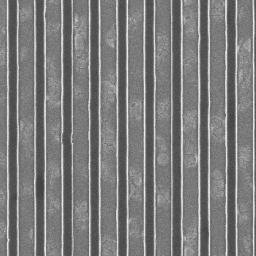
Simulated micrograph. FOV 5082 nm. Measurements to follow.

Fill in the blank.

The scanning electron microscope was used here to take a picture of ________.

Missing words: parallel lines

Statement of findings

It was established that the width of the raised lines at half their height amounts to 213 nanometers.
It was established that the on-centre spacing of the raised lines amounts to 543 nm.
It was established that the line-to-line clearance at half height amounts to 0.338 micrometres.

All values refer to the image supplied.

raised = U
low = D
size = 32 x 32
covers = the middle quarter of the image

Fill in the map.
UUDDDDUUUDDDDUUUDDDDUUUDDDDUUDDD
UUDDDDUUUDDDDUUUDDDDUUUDDDDUUDDD
UUDDDDUUUDDDDUUUDDDDUUUDDDDUUDDD
UUDDDDUUUDDDDUUUDDDDUUUDDDDUUDDD
UUDDDDUUUDDDDUUUDDDDUUUDDDDUUDDD
UUDDDDUUUDDDDUUUDDDDUUUDDDDUUDDD
UUDDDDUUUDDDDUUUDDDDUUUDDDDUUDDD
UUDDDDDUUDDDDUUUDDDDUUUDDDDUUDDD
UUDDDDUUUDDDDUUUDDDDUUUDDDDUUDDD
UUDDDDUUUDDDDUUUDDDDUUUDDDDUUDDD
UUDDDDUUUDDDDUUUDDDDUUUDDDDUUDDD
UUDDDDUUUDDDDUUUDDDDUUUDDDDUUDDD
UUDDDDUUUDDDDUUUDDDDUUUDDDDUUDDD
UUDDDDUUUDDDDUUUDDDDUUUDDDDUUDDD
UUDDDDUUUDDDDUUUDDDDUUUDDDDUUDDD
UUDDDDUUUDDDDUUUDDDDUUUDDDDUUDDD
UUDDDDUUUDDDDUUUDDDDUUUDDDDUUDDD
UUDDDDUUUDDDDUUUDDDDUUUDDDDUUDDD
UUDDDDUUUDDDDUUUDDDDUUUDDDDUUDDD
UUDDDDUUUDDDDUUUDDDDUUUDDDDUUDDD
UUDDDDUUUDDDDUUUDDDDUUUDDDDUUDDD
UUDDDDUUUDDDDUUUDDDDUUUDDDDUUDDD
UUDDDDUUUDDDDUUUDDDDUUUDDDDUUDDD
UUDDDDUUUDDDDUUUDDDDUUDDDDDUUDDD
UUDDDDUUUDDDDUUUDDDDUUDDDDDUUDDD
UUDDDDUUUDDDDUUUDDDDUUUDDDDUUDDD
UUDDDDUUUDDDDUUUDDDDUUUDDDDUUDDD
UUDDDDUUUDDDDUUUDDDDUUUDDDDUUDDD
UUDDDDUUUDDDDUUUDDDDUUUDDDDUUDDD
UUDDDDUUUDDDDDUUDDDDUUUDDDDUUDDD
UUDDDDUUUDDDDUUUDDDDUUUDDDDUUDDD
UUDDDDUUUDDDDUUUDDDDUUUDDDDUUDDD